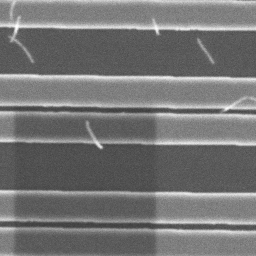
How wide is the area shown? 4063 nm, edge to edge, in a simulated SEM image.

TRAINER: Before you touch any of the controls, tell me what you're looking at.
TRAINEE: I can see lines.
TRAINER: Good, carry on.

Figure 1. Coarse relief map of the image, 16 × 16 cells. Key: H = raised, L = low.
HHHHHHHHHHHHHHHH
HHHHHHHHHHHHHHHH
LLLLLLLLLLLLLLLL
LLLLLLLLLLLLLLLL
LLLLLLLLLLLLLLLL
HHHHHHHHHHHHHHHH
HHHHHHHHHHHHHHHH
HHHHHHHHHHHHHHHH
HHHHHHHHHHHHHHHH
LLLLLLLLLLLLLLLL
LLLLLLLLLLLLLLLL
LLLLLLLLLLLLLLLL
HHHHHHHHHHHHHHHH
HHHHHHHHHHHHHHHH
HHHHHHHHHHHHHHHH
HHHHHHHHHHHHHHHH